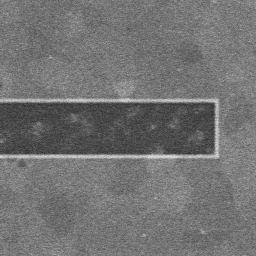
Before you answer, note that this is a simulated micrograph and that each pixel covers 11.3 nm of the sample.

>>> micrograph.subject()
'one or a few lines or trenches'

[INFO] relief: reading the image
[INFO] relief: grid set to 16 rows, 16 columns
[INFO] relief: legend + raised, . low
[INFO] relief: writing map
++++++++++++++++
++++++++++++++++
++++++++++++++++
++++++++++++++++
++++++++++++++++
++++++++++++++++
.............+++
..............++
..............++
.............+++
++++++++++++++++
++++++++++++++++
++++++++++++++++
++++++++++++++++
++++++++++++++++
++++++++++++++++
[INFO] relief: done